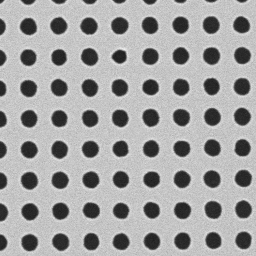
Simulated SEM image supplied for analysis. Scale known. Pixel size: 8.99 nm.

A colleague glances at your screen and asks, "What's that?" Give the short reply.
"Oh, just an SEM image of a regular array of holes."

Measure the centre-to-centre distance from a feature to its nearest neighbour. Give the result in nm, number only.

272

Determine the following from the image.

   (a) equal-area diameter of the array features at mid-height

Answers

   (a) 156 nanometres